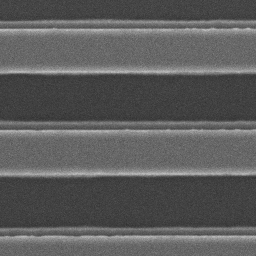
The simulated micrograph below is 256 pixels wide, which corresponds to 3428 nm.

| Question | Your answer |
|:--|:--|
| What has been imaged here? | lines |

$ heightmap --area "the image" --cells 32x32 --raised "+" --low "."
................................
................................
................................
++++++++++++++++++++++++++++++++
++++++++++++++++++++++++++++++++
++++++++++++++++++++++++++++++++
++++++++++++++++++++++++++++++++
++++++++++++++++++++++++++++++++
++++++++++++++++++++++++++++++++
................................
................................
................................
................................
................................
................................
....+..........+..+++.++.+++++++
++++++++++++++++++++++++++++++++
++++++++++++++++++++++++++++++++
++++++++++++++++++++++++++++++++
++++++++++++++++++++++++++++++++
++++++++++++++++++++++++++++++++
++++++++++++++++++++++++++++++++
................................
................................
................................
................................
................................
................................
................................
++++++++++++++++++++++++++++++++
++++++++++++++++++++++++++++++++
++++++++++++++++++++++++++++++++